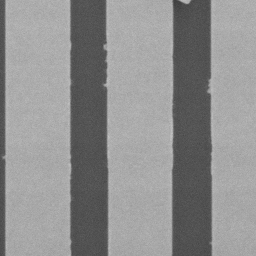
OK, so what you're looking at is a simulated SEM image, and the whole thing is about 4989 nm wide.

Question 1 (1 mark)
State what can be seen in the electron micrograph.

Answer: lines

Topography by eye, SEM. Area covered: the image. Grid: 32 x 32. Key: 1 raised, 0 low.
01111111100001111111110000111111
01111111100001111111110000111111
01111111100001111111110000111111
01111111100001111111110000111111
01111111100001111111110000111111
01111111100001111111110000111111
01111111100001111111110000111111
01111111100001111111110000111111
01111111100001111111110000111111
01111111100001111111110000111111
01111111100001111111110000111111
01111111100001111111110000111111
01111111100001111111110000111111
01111111100001111111100000111111
01111111100001111111110000111111
01111111100001111111110000111111
01111111100001111111110000111111
01111111100001111111110000111111
01111111100001111111110000011111
01111111100001111111110000111111
01111111100001111111110000111111
01111111100000111111100000111111
01111111100000111111100000011111
01111111100000111111100000011111
01111111100000111111100000011111
01111111100000111111100000011111
01111111100000111111100000011111
01111111100000111111100000011111
01111111100000111111100000011111
01111111100000111111100000011111
01111111100000111111100000011111
01111111100000111111100000011111